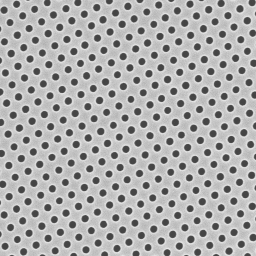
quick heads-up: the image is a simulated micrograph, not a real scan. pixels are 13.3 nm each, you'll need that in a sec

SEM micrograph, a regular array of holes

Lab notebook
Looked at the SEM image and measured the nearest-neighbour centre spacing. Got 180 nanometres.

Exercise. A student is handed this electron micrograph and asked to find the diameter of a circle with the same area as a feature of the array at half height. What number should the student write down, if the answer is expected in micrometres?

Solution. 0.0974